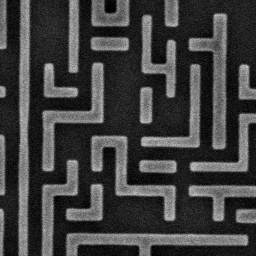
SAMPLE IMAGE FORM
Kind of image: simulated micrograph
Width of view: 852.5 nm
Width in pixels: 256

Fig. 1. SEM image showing wiring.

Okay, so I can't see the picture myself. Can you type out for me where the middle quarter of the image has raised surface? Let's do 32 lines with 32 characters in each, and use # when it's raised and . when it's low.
.##....###..........########....
.##....###..........########....
.......###...............###....
.......###................##....
.......###................##....
.......###................#.....
###....###.........###....#.....
###....###.........###....#.....
.......###.........###..........
.......###.........###..........
.......###.........###..........
.......###.........###..........
##########.........###..........
##########.........###..........
#########..........###..........
................................
................................
................................
.......#########....############
.......#########...#############
.......###..####............####
.......##....###................
.......##....###................
.......##....###................
.##....##....###...#########....
.##....##....##....#########....
.##....##....##....#########....
.##..........##.................
.##..........##.................
.##..........##.................
###....##....###................
###....##....###############...#